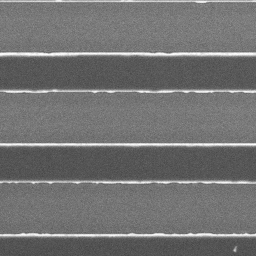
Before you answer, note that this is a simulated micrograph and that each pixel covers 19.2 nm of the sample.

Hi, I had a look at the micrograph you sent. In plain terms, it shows lines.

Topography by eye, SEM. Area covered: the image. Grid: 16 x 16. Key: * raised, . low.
................
................
................
****************
****************
****************
................
................
................
****************
****************
................
................
................
................
****************